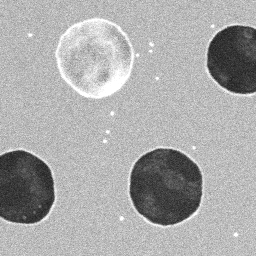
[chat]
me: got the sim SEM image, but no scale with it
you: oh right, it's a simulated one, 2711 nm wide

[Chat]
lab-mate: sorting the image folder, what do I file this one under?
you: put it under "holes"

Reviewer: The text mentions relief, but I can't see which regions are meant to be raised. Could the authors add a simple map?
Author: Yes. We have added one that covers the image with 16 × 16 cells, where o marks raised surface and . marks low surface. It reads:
oooooooooooooooo
oooooooooooooooo
ooooooooooooo...
ooooooooooooo...
ooooooooooooo...
oooooooooooooo..
oooooooooooooooo
oooooooooooooooo
oooooooooooooooo
o.ooooooo..ooooo
...ooooo....oooo
...ooooo.....ooo
...ooooo.....ooo
...oooooo...oooo
oooooooooooooooo
oooooooooooooooo